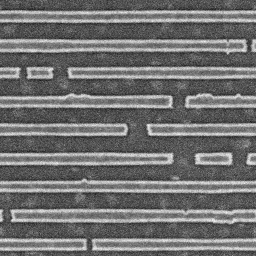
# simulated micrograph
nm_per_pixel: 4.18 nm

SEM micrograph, parallel lines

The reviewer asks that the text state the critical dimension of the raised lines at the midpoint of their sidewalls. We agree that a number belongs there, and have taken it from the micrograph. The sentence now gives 35.5 nanometres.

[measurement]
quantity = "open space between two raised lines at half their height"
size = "82 nanometers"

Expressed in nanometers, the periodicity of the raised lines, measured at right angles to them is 119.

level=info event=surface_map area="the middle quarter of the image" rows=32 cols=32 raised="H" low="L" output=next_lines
LLLLLLLLLLLLLLLLLLLLLLLLLLLLLLLL
LHHHHHHHHHHHHHHHHHHHHHHHHHHHHHHH
LHHHHHHHHHHHHHHHHHHHHHHHHHHHHHHH
LLLLLLLLLLLLLLLLLLLLLLLLLLLLLLLL
LLLLLLLLLLLLLLLLLLLLLLLLLLLLLLLL
LLLLLLLLLLLLLLLLLLLLLLLLLLLLLLLL
LLLLLLLLLLLLLLLLLLLLLLLLLLLLLLLL
LLLLLLLLLLLLLLLLLLLLLLLLLLLLLLLL
HHHHHHHHHHHHHHHHHHHHHHHHHHHLLLLH
HHHHHHHHHHHHHHHHHHHHHHHHHHHLLLLH
LLLLLLLLLLLLLLLLLLLLLLLLLLLLLLLL
LLLLLLLLLLLLLLLLLLLLLLLLLLLLLLLL
LLLLLLLLLLLLLLLLLLLLLLLLLLLLLLLL
LLLLLLLLLLLLLLLLLLLLLLLLLLLLLLLL
LLLLLLLLLLLLLLLLLLLLLLLLLLLLLLLL
HHHHHHHHHHHHHHHLLLLLLHHHHHHHHHHH
HHHHHHHHHHHHHHHLLLLLLHHHHHHHHHHH
HHHHHHHHHLLLLLLLLLLLLLHHHHHHLLLL
LLLLLLLLLLLLLLLLLLLLLLLLLLLLLLLL
LLLLLLLLLLLLLLLLLLLLLLLLLLLLLLLL
LLLLLLLLLLLLLLLLLLLLLLLLLLLLLLLL
LLLLLLLLLLLLLLLLLLLLLLLLLLLLLLLL
LLLLLLLLLLLLLLLLLLLLLLLLLLLLLLLL
HHHHHHHHHHHHHHHHHHHHHHHHHHLLLLLL
HHHHHHHHHHHHHHHHHHHHHHHHHHLLLLLL
LLLLLLLLLLLLLLLLLLLLLLLLLLLLLLLL
LLLLLLLLLLLLLLLLLLLLLLLLLLLLLLLL
LLLLLLLLLLLLLLLLLLLLLLLLLLLLLLLL
LLLLLLLLLLLLLLLLLLLLLLLLLLLLLLLL
LLLLHHLLLLLLLLLLLLLLLLLLLLLLLLLL
HHHHHHHHHHHHHHHHHHHHHHHHHHHHHHHH
HHLHHHHHHHHHHHHHHHHHHHHHHHHHHHHH